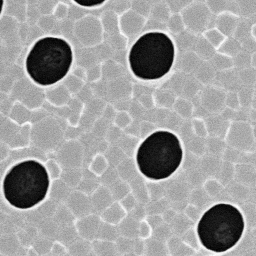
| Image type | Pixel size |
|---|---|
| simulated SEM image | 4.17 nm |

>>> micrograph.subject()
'holes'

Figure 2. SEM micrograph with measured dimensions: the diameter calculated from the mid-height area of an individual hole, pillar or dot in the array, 196 nm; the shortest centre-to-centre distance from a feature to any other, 99.7 px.